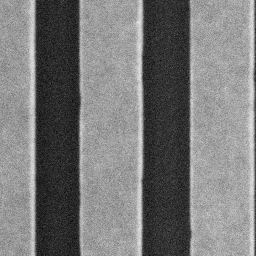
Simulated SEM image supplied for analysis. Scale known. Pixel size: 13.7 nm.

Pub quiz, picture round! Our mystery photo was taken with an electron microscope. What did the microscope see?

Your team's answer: lines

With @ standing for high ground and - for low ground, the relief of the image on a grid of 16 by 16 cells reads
@@---@@@@---@@@@
@@---@@@@---@@@@
@@---@@@@---@@@@
@@---@@@@---@@@@
@@---@@@@---@@@@
@@---@@@@---@@@@
@@---@@@@---@@@@
@@---@@@@---@@@@
@@---@@@@---@@@@
@@---@@@@---@@@@
@@---@@@@---@@@@
@@---@@@@---@@@@
@@---@@@@---@@@@
@@---@@@@---@@@@
@@---@@@@---@@@@
@@---@@@@---@@@@